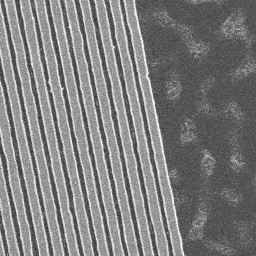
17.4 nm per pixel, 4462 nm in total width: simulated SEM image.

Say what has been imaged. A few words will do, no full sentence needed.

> parallel lines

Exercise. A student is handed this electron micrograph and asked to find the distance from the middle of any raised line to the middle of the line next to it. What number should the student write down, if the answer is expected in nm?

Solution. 256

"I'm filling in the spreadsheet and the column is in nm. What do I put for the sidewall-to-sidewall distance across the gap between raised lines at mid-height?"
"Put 87.7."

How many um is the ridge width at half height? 0.16